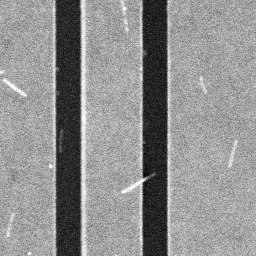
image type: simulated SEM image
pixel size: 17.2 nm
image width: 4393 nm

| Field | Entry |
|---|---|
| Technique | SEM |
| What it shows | lines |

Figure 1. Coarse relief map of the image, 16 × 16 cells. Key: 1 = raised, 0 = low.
1110011110111111
1110011110011111
1110011110011111
1110011110011111
1110011110011111
1110011110011111
1110011110011111
1110011110011111
1110011110011111
1110011110011111
1110011110011111
1110011110011111
1110011110011111
1110011110011111
1110011110011111
1110011110011111